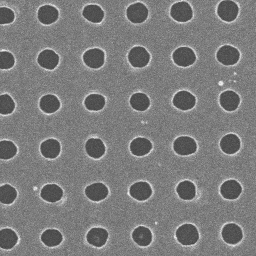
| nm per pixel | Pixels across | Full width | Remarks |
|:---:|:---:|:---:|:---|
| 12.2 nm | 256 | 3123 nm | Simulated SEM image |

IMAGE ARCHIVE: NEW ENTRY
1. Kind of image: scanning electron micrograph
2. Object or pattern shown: a regular array of holes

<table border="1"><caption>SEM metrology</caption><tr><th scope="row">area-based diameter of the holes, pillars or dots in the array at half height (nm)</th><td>255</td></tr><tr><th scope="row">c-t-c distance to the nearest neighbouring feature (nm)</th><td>539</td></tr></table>